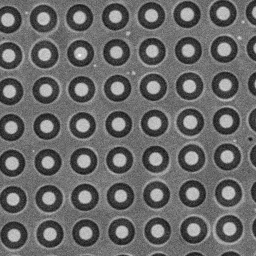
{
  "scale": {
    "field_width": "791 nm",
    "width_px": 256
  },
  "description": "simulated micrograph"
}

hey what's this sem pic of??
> an array of small figures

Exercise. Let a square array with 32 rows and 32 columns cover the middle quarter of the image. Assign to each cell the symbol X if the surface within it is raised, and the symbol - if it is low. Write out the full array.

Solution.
XXX--XXXXXXX--XXXXXXX-XXXXXXXXXX
XXXXXXXXXXXXXXXXXXXXXXXXXXXXXXXX
XXXXXXXXXXXXXXXXXXXXX--XXXXXX---
XXX---XXXXX-----XXXX-----XXX----
XX-----XXX-------XX-------XX----
X-------XX-------XX-------XX----
X-------XX-------XX-------XX----
X-------XX-------XX------XXX----
XX-----XXXX-----XXXX-----XXXX---
XXX---XXXXXXX-XXXXXXXXXXXXXXXXXX
XXXXXXXXXXXXXXXXXXXXXXXXXXXXXXXX
XXXXXXXXXXXXXXXXXXXXXX-XXXXXXX--
XXX----XXXX-----XXXX-----XXXX---
XX------XXX------XX-------XX----
X-------XX-------XX-------XX----
X-------XX-------XX-------XX----
X-------XXX------XX-------XX----
XX-----XXXX-----XXXX-----XXXX---
XXX---XXXXXXX-XXXXXXXXXXXXXXXXXX
XXXXXXXXXXXXXXXXXXXXXXXXXXXXXXXX
XXXXXXXXXXXXXXXXXXXXXX--XXXXXX--
XXX----XXXXX----XXXX-----XXXX---
XX------XXX------XXX------XXX---
XX------XXX------XX-------XX----
X-------XX-------XXX------XX----
XX------XXX------XXX------XXX---
XX------XXX-----XXXXX-----XXXX--
XXXX--XXXXXXX-XXXXXXXXX-XXXXXXXX
XXXXXXXXXXXXXXXXXXXXXXXXXXXXXXXX
XXXXXXXXXXXXXXXXXXXXX----XXXXX--
XXX----XXXXX-----XXX------XXX---
XX------XXX------XXX------XXX---